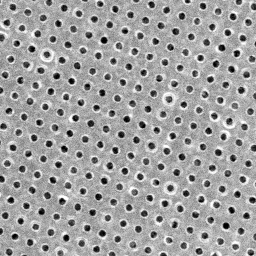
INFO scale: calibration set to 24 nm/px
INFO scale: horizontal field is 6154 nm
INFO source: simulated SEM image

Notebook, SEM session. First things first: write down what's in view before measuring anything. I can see a regular array of raised bodies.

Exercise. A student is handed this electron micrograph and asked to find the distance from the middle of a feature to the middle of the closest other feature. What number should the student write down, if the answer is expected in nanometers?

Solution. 386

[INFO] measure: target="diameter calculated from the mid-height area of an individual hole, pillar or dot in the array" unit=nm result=199